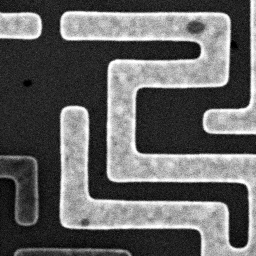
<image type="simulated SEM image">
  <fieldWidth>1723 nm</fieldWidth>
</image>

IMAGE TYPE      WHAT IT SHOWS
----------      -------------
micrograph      wiring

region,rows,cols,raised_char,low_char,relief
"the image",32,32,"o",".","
...............................o
...............................o
ooooo...ooooooooooooooooooooo..o
ooooo...ooooooooooooooooooooo..o
ooooo...ooooooooooooooooooooo..o
.........................oooo..o
.........................oooo..o
........................ooooo..o
..............oooooooooooooo...o
..............oooooooooooooo...o
..............oooooooooooooo...o
..............ooo..............o
..............ooo..............o
........oo....ooo..............o
........ooo...ooo.........oooooo
........ooo..oooo........ooooooo
........ooo..oooo.........oooooo
........ooo..oooo...............
........ooo..oooo...............
........ooo..ooooooooooooooooooo
ooooo...ooo..ooooooooooooooooooo
ooooo...ooo..ooooooooooooooooooo
..ooo...ooo...oooooooooooooooooo
..ooo...ooo....................o
..ooo...ooo....................o
..ooo...oooooooooooooooooooo...o
..ooo...oooooooooooooooooooo...o
..ooo...oooooooooooooooooooo...o
...........ooo..........oooo...o
.........................ooo...o
.........................oooo..o
..oooooooooooooo.........ooooooo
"